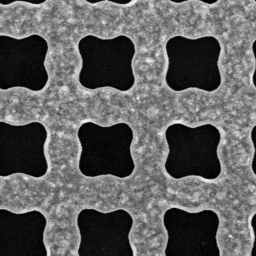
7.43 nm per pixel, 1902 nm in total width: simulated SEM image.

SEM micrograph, holes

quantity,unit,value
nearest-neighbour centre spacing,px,86.8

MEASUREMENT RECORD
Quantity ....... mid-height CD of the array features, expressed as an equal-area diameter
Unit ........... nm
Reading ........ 435